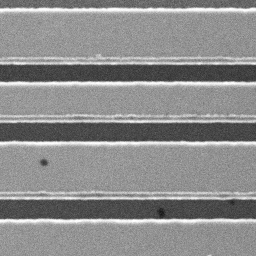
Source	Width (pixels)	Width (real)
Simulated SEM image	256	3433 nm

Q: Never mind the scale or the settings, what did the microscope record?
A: lines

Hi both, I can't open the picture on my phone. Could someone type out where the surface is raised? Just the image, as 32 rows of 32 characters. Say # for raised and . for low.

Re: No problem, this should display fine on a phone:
................................
################################
################################
################################
################################
################################
################################
################################
................................
................................
################################
################################
################################
################################
################################
................................
................................
................................
################################
################################
################################
################################
################################
################################
################################
................................
................................
................................
################################
################################
################################
################################